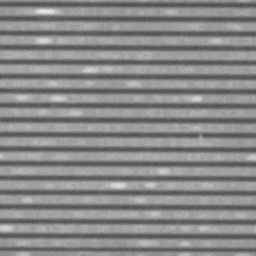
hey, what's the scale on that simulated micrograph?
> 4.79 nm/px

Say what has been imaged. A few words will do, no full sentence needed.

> parallel lines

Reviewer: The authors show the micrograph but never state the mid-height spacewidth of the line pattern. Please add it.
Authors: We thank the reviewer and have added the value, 6.24 px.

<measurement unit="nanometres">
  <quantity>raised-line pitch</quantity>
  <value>69.3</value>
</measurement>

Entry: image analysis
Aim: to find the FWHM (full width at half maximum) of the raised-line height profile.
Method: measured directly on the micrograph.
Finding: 38.9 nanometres